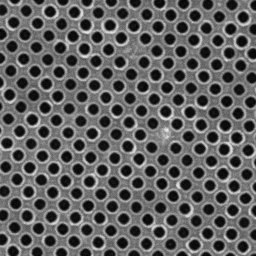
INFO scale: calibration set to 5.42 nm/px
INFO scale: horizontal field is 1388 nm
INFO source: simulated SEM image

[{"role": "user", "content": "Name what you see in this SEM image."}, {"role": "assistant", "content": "a regular array of holes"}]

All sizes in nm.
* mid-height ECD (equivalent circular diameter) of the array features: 65.3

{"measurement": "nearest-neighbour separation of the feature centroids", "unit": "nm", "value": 90.7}